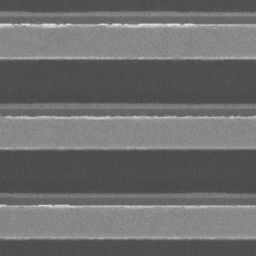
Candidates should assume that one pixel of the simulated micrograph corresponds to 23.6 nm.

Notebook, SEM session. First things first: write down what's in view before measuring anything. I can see lines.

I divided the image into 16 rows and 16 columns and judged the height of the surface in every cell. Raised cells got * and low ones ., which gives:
................
****************
****************
****************
................
................
................
****************
****************
................
................
................
****************
****************
****************
................